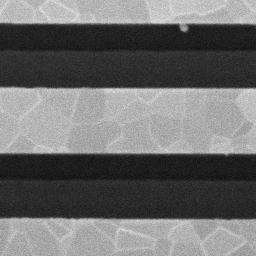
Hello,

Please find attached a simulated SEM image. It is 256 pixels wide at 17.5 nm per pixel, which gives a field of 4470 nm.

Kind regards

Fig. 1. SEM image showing lines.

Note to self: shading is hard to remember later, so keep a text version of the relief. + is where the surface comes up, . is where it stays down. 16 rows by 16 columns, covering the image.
++++++++++++++++
................
................
................
................
................
++++++++++++++++
++++++++++++++++
++++++++++++++++
++++++++++++++++
................
................
................
................
++++++++++++++++
++++++++++++++++